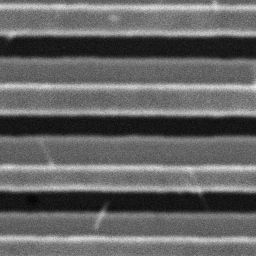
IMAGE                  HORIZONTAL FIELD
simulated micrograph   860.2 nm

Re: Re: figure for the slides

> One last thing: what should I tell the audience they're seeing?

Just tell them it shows lines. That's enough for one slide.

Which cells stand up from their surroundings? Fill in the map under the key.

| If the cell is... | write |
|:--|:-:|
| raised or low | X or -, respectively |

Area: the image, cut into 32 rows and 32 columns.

XXXXXXXXXXXXXXXXXXXXXXXXXXXXXXXX
XXXXXXXXXXXXXXXXXXXXXXXXXXXXXXXX
XXXXXXXXXXXXXXXXXXXXXXXXXXXXXXXX
XXXXXXXXXXXXXXXXXXXXXXXXXXXXXXXX
-X------------------------------
--------------------------------
--------------------------------
XXXXXXXXXXXXXXXXXXXXXXXXXXXX-XX-
XXXXXXXXXXXXXXXXXXXXXXXXXXXXXXXX
XXXXXXXXXXXXXXXXXXXXXXXXXXXXXXXX
XXXXXXXXXXXXXXXXXXXXXXXXXXXXXXXX
XXXXXXXXXXXXXXXXXXXXXXXXXXXXXXXX
XXXXXXXXXXXXXXXXXXXXXXXXXXXXXXXX
XXXXXXXXXXXXXXXXXXXXXXXXXXXXXXXX
--------------------------------
--------------------------------
--------------------------------
XXXXXXXXXXXXXXXXXXXXXXXXXXXXXXXX
XXXXXXXXXXXXXXXXXXXXXXXXXXXXXXXX
XXXXXXXXXXXXXXXXXXXXXXXXXXXXXXXX
XXXXXXXXXXXXXXXXXXXXXXXXXXXXXXXX
XXXXXXXXXXXXXXXXXXXXXXXXXXXXXXXX
XXXXXXXXXXXXXXXXXXXXXXXXXXXXXXXX
XXXXXXXXXXXXXXXXXXXXXXXXXXXXXXXX
--------------------------------
--------------------------------
--------------------------------
XXXXXXXXXXXXXXXXXXXXXXXXXXXXXXXX
XXXXXXXXXXXXXXXXXXXXXXXXXXXXXXXX
XXXXXXXXXXXXXXXXXXXXXXXXXXXXXXXX
XXXXXXXXXXXXXXXXXXXXXXXXXXXXXXXX
XXXXXXXXXXXXXXXXXXXXXXXXXXXXXXXX